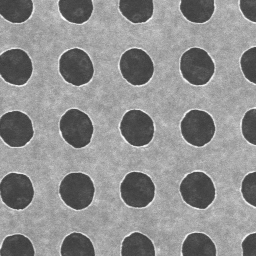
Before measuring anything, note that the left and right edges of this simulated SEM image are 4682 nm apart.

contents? a regular array of holes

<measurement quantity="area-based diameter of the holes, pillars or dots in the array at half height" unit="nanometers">660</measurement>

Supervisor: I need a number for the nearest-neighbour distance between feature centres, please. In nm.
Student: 1100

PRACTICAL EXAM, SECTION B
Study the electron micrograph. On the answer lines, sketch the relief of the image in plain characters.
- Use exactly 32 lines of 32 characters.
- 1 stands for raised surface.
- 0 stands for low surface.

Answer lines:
00001110000011100001111000011100
00001110000111100001111000011100
10011111000111110011111100111110
11111111111111111111111111111111
11111111111111111111111111111111
11111111111111111111111111111111
10011111000111110011111000111110
00001110000111100001111000111100
00001110000011100001110000011100
00001111000011100001111000011110
10011111100111110011111100111111
11111111111111111111111111111111
11111111111111111111111111111111
11111111111111111111111111111111
00011111000111100001111000111100
00001110000011100001111000011100
00001111000011100001111000011100
00001111000111110001111000111110
11111111111111111111111111111111
11111111111111111111111111111111
11111111111111111111111111111111
11111111111111110111111101111110
00001111000011100001111000111100
00001110000011100001110000011100
00001111000011100001111000011100
10001111000111110001111000111110
11111111111111111111111111111111
11111111111111111111111111111111
11111111111111111111111111111111
10011111000111110011111000111110
00001111000011100001111000011100
00001111000011100001111000011100